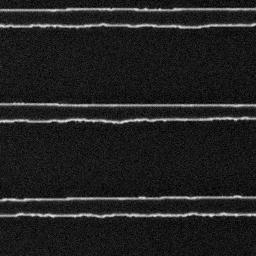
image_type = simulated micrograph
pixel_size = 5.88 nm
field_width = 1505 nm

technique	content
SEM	lines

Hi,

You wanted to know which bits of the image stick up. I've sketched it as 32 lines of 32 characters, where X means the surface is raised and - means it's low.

--------------------------------
XXXXXXXXXXXXXXXXXXXXXXXXXXXXXXXX
XXXXXXXXXXXXXXXXXXXXXXXXXXXXXXXX
--------------------------------
--------------------------------
--------------------------------
--------------------------------
--------------------------------
--------------------------------
--------------------------------
--------------------------------
--------------------------------
--------------------------------
XXXXXXXXXXXXXXXXXXXXXXXXXXXXXXXX
XXXXXXXXXXXXXXXXXXXXXXXXXXXXXXXX
--------------------------------
--------------------------------
--------------------------------
--------------------------------
--------------------------------
--------------------------------
--------------------------------
--------------------------------
--------------------------------
--------------------------------
XXXXXXXXXXXXXXXXXXXXXXXXXXXXXXXX
XXXXXXXXXXXXXXXXXXXXXXXXXXXXXXXX
--------------------------------
--------------------------------
--------------------------------
--------------------------------
--------------------------------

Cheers